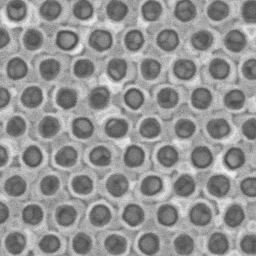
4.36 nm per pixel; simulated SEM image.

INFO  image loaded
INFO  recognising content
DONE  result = a regular array of holes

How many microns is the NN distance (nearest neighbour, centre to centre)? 0.143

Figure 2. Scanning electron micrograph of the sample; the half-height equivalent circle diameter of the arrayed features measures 96.9 nm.